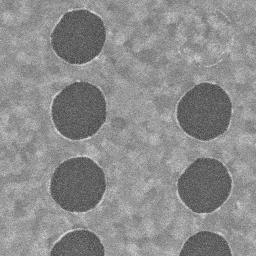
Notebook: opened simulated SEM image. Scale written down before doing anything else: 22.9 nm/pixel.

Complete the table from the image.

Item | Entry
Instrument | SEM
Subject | holes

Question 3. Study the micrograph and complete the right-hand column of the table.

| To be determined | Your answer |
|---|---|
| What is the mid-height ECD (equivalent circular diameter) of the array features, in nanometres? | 1300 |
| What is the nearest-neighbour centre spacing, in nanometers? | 1690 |